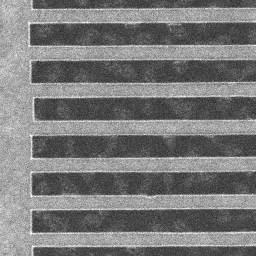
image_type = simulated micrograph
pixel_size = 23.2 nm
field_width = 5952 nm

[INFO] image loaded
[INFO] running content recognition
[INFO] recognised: parallel lines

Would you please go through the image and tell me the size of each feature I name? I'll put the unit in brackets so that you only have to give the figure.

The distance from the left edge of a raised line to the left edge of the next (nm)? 867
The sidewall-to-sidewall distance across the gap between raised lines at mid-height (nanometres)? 308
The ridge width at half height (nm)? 561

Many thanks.